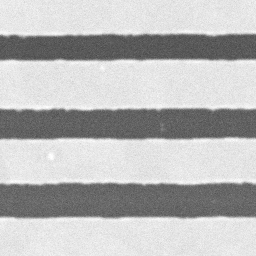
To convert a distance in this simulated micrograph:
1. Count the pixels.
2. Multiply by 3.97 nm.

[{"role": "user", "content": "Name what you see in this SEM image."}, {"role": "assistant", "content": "lines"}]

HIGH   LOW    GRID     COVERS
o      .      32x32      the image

oooooooooooooooooooooooooooooooo
oooooooooooooooooooooooooooooooo
oooooooooooooooooooooooooooooooo
oooooooooooooooooooooooooooooooo
................................
................................
................................
................................
oooooooooooooooooooooooooooooooo
oooooooooooooooooooooooooooooooo
oooooooooooooooooooooooooooooooo
oooooooooooooooooooooooooooooooo
oooooooooooooooooooooooooooooooo
ooooooo.oooooooooooo......o.oooo
................................
................................
................................
.o.....oooooooo...ooo...oooooooo
oooooooooooooooooooooooooooooooo
oooooooooooooooooooooooooooooooo
oooooooooooooooooooooooooooooooo
oooooooooooooooooooooooooooooooo
oooooooooooooooooooooooooooooooo
................................
................................
................................
................................
oooooooooooooooooooooooooooooooo
oooooooooooooooooooooooooooooooo
oooooooooooooooooooooooooooooooo
oooooooooooooooooooooooooooooooo
oooooooooooooooooooooooooooooooo